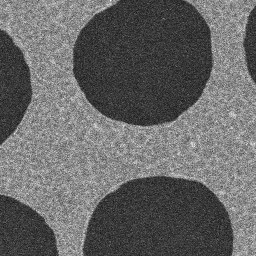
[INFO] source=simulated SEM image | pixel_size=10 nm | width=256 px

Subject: holes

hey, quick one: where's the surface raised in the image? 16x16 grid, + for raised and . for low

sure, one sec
+++++++.....++++
+++++........++.
.++++........++.
..+++........++.
..+++........++.
..+++........+++
..++++......++++
.++++++....+++++
.+++++++++++++++
++++++++++++++++
++++++++++++++++
++++++++.....+++
.+++++........++
...+++........++
...++..........+
....+..........+